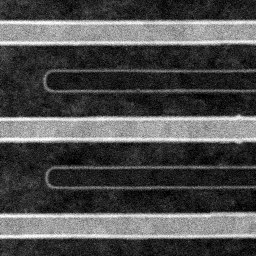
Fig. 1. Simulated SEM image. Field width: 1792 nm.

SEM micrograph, parallel lines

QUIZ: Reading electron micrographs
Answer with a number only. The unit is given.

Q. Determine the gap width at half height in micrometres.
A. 0.196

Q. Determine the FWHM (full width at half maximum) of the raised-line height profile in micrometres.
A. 0.143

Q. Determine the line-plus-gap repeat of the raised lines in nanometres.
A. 338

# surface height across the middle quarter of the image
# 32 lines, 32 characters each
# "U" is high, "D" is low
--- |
DDDDDDDDDDDDDDDDDDDDDDDDDDDDDDDD
DDDDDDDDDDDDDDDDDDDDDDDDDDDDDDDD
UUUUUUUUUUUUUUUUUUUUUUUUUUUUUUUU
UUUUUUUUUUUUUUUUUUUUUUUUUUUUUUUU
UUUUUUUUUUUUUUUUUUUUUUUUUUUUUUUU
UUUUUUUUUUUUUUUUUUUUUUUUUUUUUUUU
UUUUUUUUUUUUUUUUUUUUUUUUUUUUUUUU
DDDDDDDDDDDDDDDDDDDDDDDDDDDDDDDD
DDDDDDDDDDDDDDDDDDDDDDDDDDDDDDDD
DDDDDDDDDDDDDDDDDDDDDDDDDDDDDDDD
DDDDDDDDDDDDDDDDDDDDDDDDDDDDDDDD
DDDDDDDDDDDDDDDDDDDDDDDDDDDDDDDD
DDDDDDDDDDDDDDDDDDDDDDDDDDDDDDDD
DDDDDDDDDDDDDDDDDDDDDDDDDDDDDDDD
UUUUUUUUUUUUUUUUUUUUUUUUUUUUUUUU
UUUUUUUUUUUUUUUUUUUUUUUUUUUUUUUU
UUUUUUUUUUUUUUUUUUUUUUUUUUUUUUUU
UUUUUUUUUUUUUUUUUUUUUUUUUUUUUUUU
UUUUUUUUUUUUUUUUUUUUUUUUUUUUUUUU
DDDDDDDDDDDDDDDDDDDDDDDDDDDDDDDD
DDDDDDDDDDDDDDDDDDDDDDDDDDDDDDDD
DDDDDDDDDDDDDDDDDDDDDDDDDDDDDDDD
DDDDDDDDDDDDDDDDDDDDDDDDDDDDDDDD
DDDDDDDDDDDDDDDDDDDDDDDDDDDDDDDD
DDDDDDDDDDDDDDDDDDDDDDDDDDDDDDDD
DDDDDDDDDDDDDDDDDDDDDDDDDDDDDDDD
UUUUUUUUUUUUUUUUUUUUUUUUUUUUUUUU
UUUUUUUUUUUUUUUUUUUUUUUUUUUUUUUU
UUUUUUUUUUUUUUUUUUUUUUUUUUUUUUUU
UUUUUUUUUUUUUUUUUUUUUUUUUUUUUUUU
UUUUUUUUUUUUUUUUUUUUUUUUUUUUUUUU
DDDDDDDDDDDDDDDDDDDDDDDDDDDDDDDD